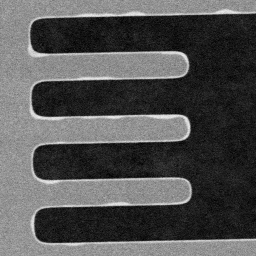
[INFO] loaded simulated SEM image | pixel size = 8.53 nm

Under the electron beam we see groups of lines, slits or small figures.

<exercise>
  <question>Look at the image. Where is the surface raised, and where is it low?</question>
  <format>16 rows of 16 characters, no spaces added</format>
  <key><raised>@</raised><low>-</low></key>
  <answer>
@@@@@@@@@@@@@@@@
@@--------------
@@--------------
@@@@@@@@@@@-----
@@@@@@@@@@@@----
@@--------------
@@--------------
@@@@@@@@@@@@----
@@@@@@@@@@@@----
@@--------------
@@--------------
@@@@@@@@@@@@----
@@@@@@@@@@@@----
@@--------------
@@--------------
@@@@@@@@@@@@@@@@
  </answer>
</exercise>